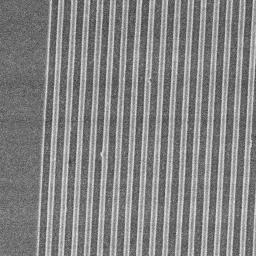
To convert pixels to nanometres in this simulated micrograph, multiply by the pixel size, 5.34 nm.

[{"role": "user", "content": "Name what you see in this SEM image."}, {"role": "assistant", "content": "parallel lines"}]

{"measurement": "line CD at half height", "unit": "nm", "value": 30.7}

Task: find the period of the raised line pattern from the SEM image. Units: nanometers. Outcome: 69.1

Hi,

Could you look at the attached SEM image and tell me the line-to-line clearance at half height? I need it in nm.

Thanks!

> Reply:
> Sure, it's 40.7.